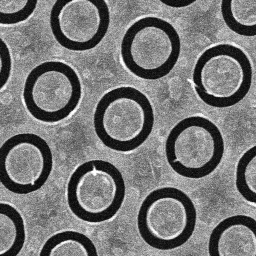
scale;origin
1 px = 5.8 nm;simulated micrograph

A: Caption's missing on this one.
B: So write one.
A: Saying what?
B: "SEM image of ring-shaped grooves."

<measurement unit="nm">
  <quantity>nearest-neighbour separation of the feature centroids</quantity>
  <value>441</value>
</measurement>